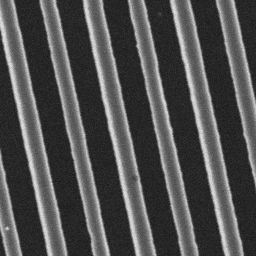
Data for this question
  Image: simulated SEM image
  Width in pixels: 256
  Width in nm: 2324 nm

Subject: lines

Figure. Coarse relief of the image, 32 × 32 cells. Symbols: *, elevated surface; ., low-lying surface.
**...**....**...**...***...**...
**...**....**...**....**...***..
**....*....**...***...**....**..
**....**...**....**...***...**..
***...**...***...**...***...**..
.**...**....**...**....**...**..
.**...**....**...**....**...***.
.**....**...**....**...**....**.
.***...**...**....**...**....**.
.***...**...***...**...***...**.
..**...**....**...**....**...**.
..**...**....**...**....**...***
..**....**...**....**...**....**
..***...**...***...**...***...**
..***...**...***...**....**...**
...**...**....**...**....**...**
...**...**....**...***...**....*
...**....**...**....**...**....*
...***...**...***...**...***...*
....**...**....**...**....**...*
....**...**....**...**....**...*
*...**....*....**...***...**....
*...**....**...**....**...**....
*...***...**...***...**...***...
*....**...**....**...**....**...
*....**...**....**...**....**...
**...**....**...**....**...**...
**...***...**...***...**...***..
**...***...**...***...**....**..
**....**...**....**...**....**..
**....**...**....**...***...**..
.**...**....**...**....**...**..